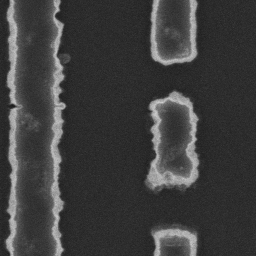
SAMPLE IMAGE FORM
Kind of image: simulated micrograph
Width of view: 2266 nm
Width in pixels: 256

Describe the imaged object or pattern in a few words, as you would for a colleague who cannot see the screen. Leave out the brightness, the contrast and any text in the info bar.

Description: one or a few lines or trenches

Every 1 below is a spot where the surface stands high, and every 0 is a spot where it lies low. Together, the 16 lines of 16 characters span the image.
0111000000110000
0111000000110000
0111000000110000
0111000000110000
0111000000000000
0111000000000000
0111000000110000
0111000000110000
0111000000110000
0110000000110000
0111000000110000
0111000000000000
0111000000000000
0111000000000000
0111000000100000
0111000000110000